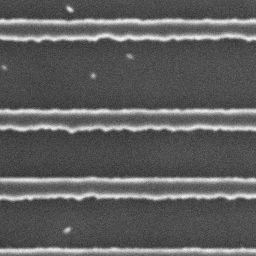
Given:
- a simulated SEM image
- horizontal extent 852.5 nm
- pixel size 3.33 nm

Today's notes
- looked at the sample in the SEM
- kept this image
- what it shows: lines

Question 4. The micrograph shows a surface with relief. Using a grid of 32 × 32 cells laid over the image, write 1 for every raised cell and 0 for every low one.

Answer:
00000000000000000000000000000000
00000000000000000000000000000000
11100000001100001000111001100101
11111111111111111111111111111111
11111111111111111111111111111111
00000000000000000000000000000000
00000000000000000000000000000000
00000000000000000000000000000000
00000000000000000000000000000000
00000000000000000000000000000000
00000000000000000000000000000000
00000000000000000000000000000000
00000000000000000000000000000000
00000000000000000000000000000000
11111111111111111111111111111111
11111111111111111111111111111111
00000000000000000000000000000000
00000000000000000000000000000000
00000000000000000000000000000000
00000000000000000000000000000000
00000000000000000000000000000000
00000000000000000000000000000000
11111111111111111111111111111111
11111111111111111111111111111111
11111111111111111111111111111111
00000000000000000000000000000000
00000000000000000000000000000000
00000000000000000000000000000000
00000000000000000000000000000000
00000000000000000000000000000000
00000000000000000000000000000000
11111111111111111111111111111111